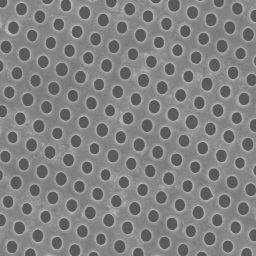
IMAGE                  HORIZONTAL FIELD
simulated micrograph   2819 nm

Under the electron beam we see a regular array of holes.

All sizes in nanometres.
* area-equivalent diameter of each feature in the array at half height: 126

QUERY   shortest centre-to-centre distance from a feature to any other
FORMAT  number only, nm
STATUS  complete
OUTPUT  219